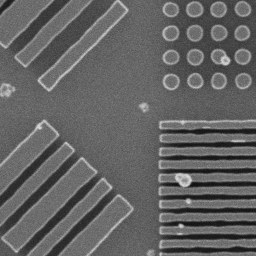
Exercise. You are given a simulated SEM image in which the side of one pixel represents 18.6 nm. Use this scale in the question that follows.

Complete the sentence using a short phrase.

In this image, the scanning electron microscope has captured groups of lines, slits or small figures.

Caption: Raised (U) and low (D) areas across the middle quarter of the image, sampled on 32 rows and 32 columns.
UUDDDDDDDDDDDDDDDDDDDDDDDDDDDDDD
UUDDDDDDDDDDDDDDDDDDDDDDDDDDDDDD
DDDDDDDDDDDDDDDDDDDDDDDDDDDDDDDD
DDDDDDDDDDDDDDDDDDDDDDDDDUUUDDDU
DDDDDDDDDDDDDDDDDDDDDDDDDUUUUDDU
DDDDDDDDDDDDDDDDDDDDDDDDDUUUDDDD
DDDDDDDDDDDDDDDDDDDDDDDDDDDDDDDD
DDDDDDDDDDDDDDDDDDDDDDDDDDDDDDDD
DDDDDDDDDDDDDDDDDDDDDDDDDDDDDDDD
DDDDDDDDDDDDDDDDDDDDDDDDDDDDDDDD
DDDDDDDDDDDDDDDDDDDDDDDDDDDDDDDD
DDDDDDDDDDDDDDDDDDDDDDDDDDDDDDDD
DDDDDDDDDDDDDDDDDDDDDDDDDDDDDDDD
DDDDDDDDDDDDDDDDDDDDDDDDDDDDDDDD
DDDDDDDDDDDDDDDDDDDDDDDDDUUUUUUU
DDDDDDDDDDDDDDDDDDDDDDDDUUUUUUUU
DDDDDDDDDDDDDDDDDDDDDDDDDDDDDDDD
DDDDDDDDDDDDDDDDDDDDDDDDDDDDDDDD
DDDDDDDDDDDDDDDDDDDDDDDDUUUUUUUU
DDDDDDDDDDDDDDDDDDDDDDDDDUUUUUUU
UUDDDDDDDDDDDDDDDDDDDDDDDDDDDDDD
UUDDDDDDDDDDDDDDDDDDDDDDUUUUUUUU
UUDDDDDDDDDDDDDDDDDDDDDDUUUUUUUU
UDDDDDDDDDDDDDDDDDDDDDDDDDDDDDDD
DDDUUDDDDDDDDDDDDDDDDDDDUUUUUUUU
DDUUUUUDDDDDDDDDDDDDDDDDUUUUUUUU
DUUUUUUUDDDDDDDDDDDDDDDDDDDDDDDD
UUUUUUUUDDDDDDDDDDDDDDDDDDDUUUUU
UUUUUUUDDDDDDDDDDDDDDDDDUUUUUUUU
UUUUUUDDDUUDDDDDDDDDDDDDDDDDUUUU
UUUUUDDDUUUDDDDDDDDDDDDDDDDDDUUD
UUUDDDDUUUUDDDDDDDDDDDDDUUUUUUUU